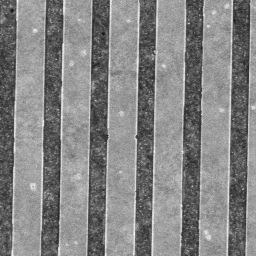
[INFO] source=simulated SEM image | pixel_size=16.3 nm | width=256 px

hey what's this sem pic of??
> parallel lines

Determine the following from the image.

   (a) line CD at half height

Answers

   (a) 464 nm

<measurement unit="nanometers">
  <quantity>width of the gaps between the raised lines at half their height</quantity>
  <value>298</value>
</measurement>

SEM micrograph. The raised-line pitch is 762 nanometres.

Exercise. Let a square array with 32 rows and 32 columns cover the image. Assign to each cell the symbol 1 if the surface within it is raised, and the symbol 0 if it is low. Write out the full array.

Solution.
00111100111000111000111000111001
00111100111000111000111001111001
00111100111000111000111000111001
00111100111100111000111001111001
00111100111000111000111001111001
00111100111000111000111001111001
00111100111000111001111001111001
00111100111000111000111001111001
00111000111000111000111001111001
00111000111000111000111001111001
00111000111000111000111001111001
00111000111000111001111001111001
00111000111000111001111001111001
00111000111000111001111001111001
00111000111000111001111001111001
00111000111000111001111001111001
00111000111000111001111001111001
00111000111000111001111001111001
00111000111000111011111001111001
00111000111001111001111001111001
00111000111001111001111001111001
00111000111001111001111001111001
00111000111001111001111001111001
00111000111001111001111001111001
00111000111001111001111001110001
00111000111001111001111001110001
00111000111001111001111001110001
00111000111001111001111001110001
00111001111001111001111001110001
00111001111001111001111001110001
00111001111001111001111001110001
00111001111001111001111001110001